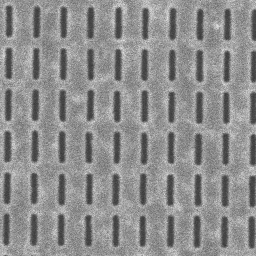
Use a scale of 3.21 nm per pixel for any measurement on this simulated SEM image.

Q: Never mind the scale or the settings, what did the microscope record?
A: a regular array of holes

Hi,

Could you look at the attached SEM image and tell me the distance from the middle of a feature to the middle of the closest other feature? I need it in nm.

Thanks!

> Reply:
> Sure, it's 86.9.